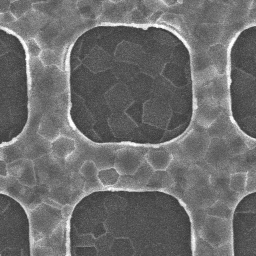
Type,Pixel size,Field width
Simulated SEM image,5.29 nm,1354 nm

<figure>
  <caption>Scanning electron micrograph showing holes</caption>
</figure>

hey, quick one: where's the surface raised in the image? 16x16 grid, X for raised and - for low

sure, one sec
XXXXXXXXXXXXXXXX
XXXXXXXXXXXXXXXX
-XXXX------XXXX-
--XX--------XX--
--XX--------XX--
--XX--------XX--
--XX--------XX--
--XXX-------XXX-
-XXXX------XXXXX
XXXXXXXXXXXXXXXX
XXXXXXXXXXXXXXXX
XXXXXXXXXXXXXXXX
-XXXX------XXXX-
--XX--------XXX-
--XX--------XXX-
--XX--------XXX-